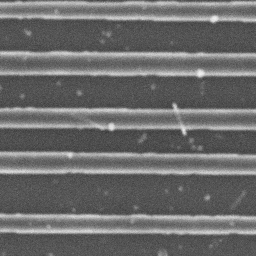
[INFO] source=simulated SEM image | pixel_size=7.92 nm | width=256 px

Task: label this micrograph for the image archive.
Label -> lines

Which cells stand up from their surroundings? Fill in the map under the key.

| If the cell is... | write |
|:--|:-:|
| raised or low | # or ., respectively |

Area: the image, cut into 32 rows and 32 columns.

################################
################################
...................##.##########
................................
................................
................................
................................
################################
################################
.........................#......
................................
................................
................................
................................
################################
################################
................................
................................
................................
################################
################################
..######....####################
................................
................................
................................
................................
................................
################################
################################
................................
................................
................................